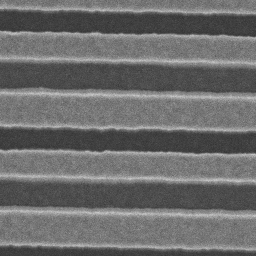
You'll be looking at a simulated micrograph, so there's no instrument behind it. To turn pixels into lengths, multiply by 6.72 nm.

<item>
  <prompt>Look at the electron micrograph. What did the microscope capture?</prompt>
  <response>lines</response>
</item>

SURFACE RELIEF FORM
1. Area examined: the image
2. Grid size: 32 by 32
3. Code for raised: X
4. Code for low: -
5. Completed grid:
XXXXXXXXXXXXXXXXXXXXXXXXXXXXXXXX
----------------------XXXXXXXXXX
--------------------------------
--------------------------------
XXXXXXXXXXXXXXXXXXXXXXXXXX-XX---
XXXXXXXXXXXXXXXXXXXXXXXXXXXXXXXX
XXXXXXXXXXXXXXXXXXXXXXXXXXXXXXXX
-----X---XXXXXXXXXXXXXXXXXXXXXXX
--------------------------------
--------------------------------
--------------------------------
XXXXXXX-------------------------
XXXXXXXXXXXXXXXXXXXXXXXXXXXXXXXX
XXXXXXXXXXXXXXXXXXXXXXXXXXXXXXXX
XXXXXXXXXXXXXXXXXXXXXXXXXXXXXXXX
XXXXXXXXXXXXXXXXXXXXXXXXXXXXXXXX
--------------------------------
--------------------------------
--------------------------------
XXXXXXXXXXXXXXXXXXXXXXXXXXXXXXXX
XXXXXXXXXXXXXXXXXXXXXXXXXXXXXXXX
XXXXXXXXXXXXXXXXXXXXXXXXXXXXXXXX
--------------------XXXXXXXXXXXX
--------------------------------
--------------------------------
--------------------------------
XXXXXXXXXXXXXXXXXXX-------------
XXXXXXXXXXXXXXXXXXXXXXXXXXXXXXXX
XXXXXXXXXXXXXXXXXXXXXXXXXXXXXXXX
XXXXXXXXXXXXXXXXXXXXXXXXXXXXXXXX
XXXXXXXXXXXXXXXXXXXXXXXXXXXXXXXX
--------------------------------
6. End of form